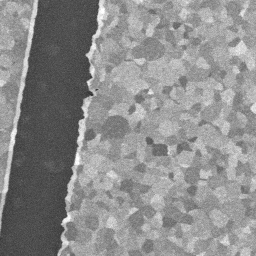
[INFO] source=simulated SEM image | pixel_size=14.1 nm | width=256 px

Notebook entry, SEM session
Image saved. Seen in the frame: one or a few lines or trenches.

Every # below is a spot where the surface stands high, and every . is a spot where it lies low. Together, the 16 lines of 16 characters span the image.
##....##########
##....##########
##....##########
##....##########
##....##########
#.....##########
#....###########
#....###########
#....###########
#....###########
#....###########
....############
....############
....############
....############
....############